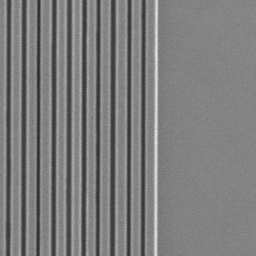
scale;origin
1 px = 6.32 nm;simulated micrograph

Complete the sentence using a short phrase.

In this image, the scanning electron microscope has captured parallel lines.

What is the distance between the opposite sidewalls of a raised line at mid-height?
61.7 nm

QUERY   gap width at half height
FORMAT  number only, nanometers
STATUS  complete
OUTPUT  33.2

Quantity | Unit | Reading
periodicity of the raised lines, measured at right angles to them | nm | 94.9